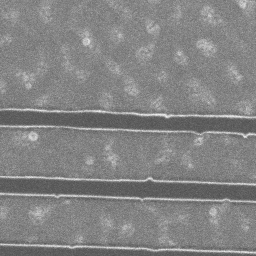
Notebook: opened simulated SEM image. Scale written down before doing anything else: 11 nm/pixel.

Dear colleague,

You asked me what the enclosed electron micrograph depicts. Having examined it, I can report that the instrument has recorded one or a few lines or trenches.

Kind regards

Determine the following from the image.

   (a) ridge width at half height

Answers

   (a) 195 nm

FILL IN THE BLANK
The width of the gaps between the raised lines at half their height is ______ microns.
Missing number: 0.546